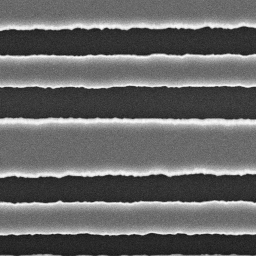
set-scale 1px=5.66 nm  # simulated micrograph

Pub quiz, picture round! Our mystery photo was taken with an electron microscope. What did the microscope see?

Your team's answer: lines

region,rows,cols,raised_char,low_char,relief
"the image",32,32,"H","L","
HHHHHHHHHHHHHHHHHHHHHHHHHHHHHHHH
HHHHHHHHHHHHHHHHHHHHHHHHHHHHHHHH
HHHHHHHHHHHHHHHHHHHHHHHHHHHHHHHH
HHHHHHHHHLHHHHHHLLLHHLHHHLLLHLLL
LLLLLLLLLLLLLLLLLLLLLLLLLLLLLLLL
LLLLLLLLLLLLLLLLLLLLLLLLLLLLLLLL
LLLLLLLLLLLLLLLLLLLLLLLLLLLLLLLL
HHHHHHHHHHHHHHHHHHHHHHHHHHHHHHHH
HHHHHHHHHHHHHHHHHHHHHHHHHHHHHHHH
HHHHHHHHHHHHHHHHHHHHHHHHHHHHHHHH
HHHHHHHHHHHHHHHHHHHHHHHHHHHHHHHH
LLLLLLLLLLLLLLLLLLLLLLLLLLLLLLLL
LLLLLLLLLLLLLLLLLLLLLLLLLLLLLLLL
LLLLLLLLLLLLLLLLLLLLLLLLLLLLLLLL
LLLLLLLLLLLLLLLLLLLLLLLLLLLLLLLL
HHHHHHHHHHHHHHHHHHHHHHHHHHHHHHHH
HHHHHHHHHHHHHHHHHHHHHHHHHHHHHHHH
HHHHHHHHHHHHHHHHHHHHHHHHHHHHHHHH
HHHHHHHHHHHHHHHHHHHHHHHHHHHHHHHH
HHHHHHHHHHHHHHHHHHHHHHHHHHHHHHHH
HHHHHHHHHHHHHHHHHHHHHHHHHHHHHHHH
HHHHHHHHHHHHHHHHHHHHHHHHHHHHHHHH
LLLLLLLLLLLLLLLLLLLLLLLLLLLLLLLL
LLLLLLLLLLLLLLLLLLLLLLLLLLLLLLLL
LLLLLLLLLLLLLLLLLLLLLLLLLLLLLLLL
HHHHHHHHHHHHHHHHHHHHHHHHHHHHHHHH
HHHHHHHHHHHHHHHHHHHHHHHHHHHHHHHH
HHHHHHHHHHHHHHHHHHHHHHHHHHHHHHHH
HHHHHHHHHHHHHHHHHHHHHHHHHHHHHHHH
LLLLLLLLLLLLLLLLLLLLLLLLLLLLLLLL
LLLLLLLLLLLLLLLLLLLLLLLLLLLLLLLL
LLLLLLLLLLLLLLLLLLLLLLLLLLLLLLLL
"